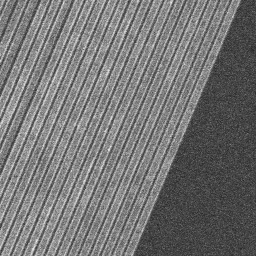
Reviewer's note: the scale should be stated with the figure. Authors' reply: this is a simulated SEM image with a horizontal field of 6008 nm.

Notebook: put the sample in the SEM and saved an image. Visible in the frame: parallel lines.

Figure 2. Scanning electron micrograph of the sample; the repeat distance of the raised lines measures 243 nm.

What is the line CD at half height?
111 nm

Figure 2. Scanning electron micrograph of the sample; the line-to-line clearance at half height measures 132 nanometres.